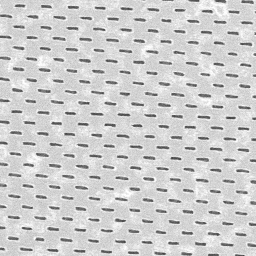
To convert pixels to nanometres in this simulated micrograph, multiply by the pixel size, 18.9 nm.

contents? a regular array of holes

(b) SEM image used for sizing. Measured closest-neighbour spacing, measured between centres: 316 nanometres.